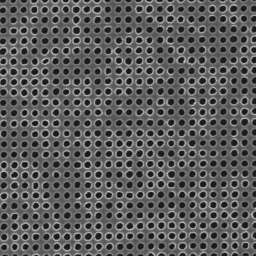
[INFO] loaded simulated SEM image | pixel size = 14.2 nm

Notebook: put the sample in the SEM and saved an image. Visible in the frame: a regular array of holes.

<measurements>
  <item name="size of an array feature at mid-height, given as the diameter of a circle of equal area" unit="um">0.0907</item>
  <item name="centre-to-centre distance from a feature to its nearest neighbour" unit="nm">143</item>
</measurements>